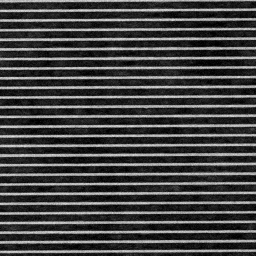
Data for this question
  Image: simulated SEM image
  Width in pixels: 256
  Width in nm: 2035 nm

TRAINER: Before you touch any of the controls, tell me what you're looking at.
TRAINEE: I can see parallel lines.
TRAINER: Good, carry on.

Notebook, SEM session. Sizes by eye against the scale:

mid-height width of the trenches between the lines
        60.6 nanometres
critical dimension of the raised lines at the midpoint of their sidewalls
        2.13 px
